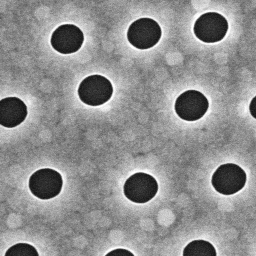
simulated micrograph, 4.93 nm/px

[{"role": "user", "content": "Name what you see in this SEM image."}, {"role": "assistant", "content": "a regular array of holes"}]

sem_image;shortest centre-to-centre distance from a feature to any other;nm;363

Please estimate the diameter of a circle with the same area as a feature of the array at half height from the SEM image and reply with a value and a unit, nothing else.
0.167 um